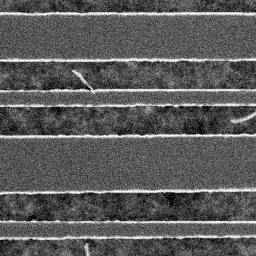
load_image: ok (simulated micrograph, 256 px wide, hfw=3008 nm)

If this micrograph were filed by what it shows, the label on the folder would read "lines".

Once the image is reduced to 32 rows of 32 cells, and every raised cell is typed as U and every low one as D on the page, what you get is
DDDDDDDDDDDDDDDDDDDDDDDDDDDDDDDD
DDDDDDDDDDDDDDDDDDDDDDDDDDDDDDDD
UUUUUUUUUUUUUUUUUUUUUUUUUUUUUUUU
UUUUUUUUUUUUUUUUUUUUUUUUUUUUUUUU
UUUUUUUUUUUUUUUUUUUUUUUUUUUUUUUU
UUUUUUUUUUUUUUUUUUUUUUUUUUUUUUUU
UUUUUUUUUUUUUUUUUUUUUUUUUUUUUUUU
UUUUUUUUUUUUUUUUDDUUUUUUUUDDUUDD
DDDDDDDDDDDDDDDDDDDDDDDDDDDDDDDD
DDDDDDDDDDDDDDDDDDDDDDDDDDDDDDDD
DDDDDDDDDDDDDDDDDDDDDDDDDDDDDDDD
UUUUUUUUUUUUUUUUUUUUUUUUUUUUUUUU
UUUUUUUUUUUUUUUUUUUUUUUUUUUUUUUU
DDDDDDDDDDDDDDDDDDDDDDDDDDDDDDDD
DDDDDDDDDDDDDDDDDDDDDDDDDDDDDDDD
DDDDDDDDDDDDDDDDDDDDDDDDDDDDDDDD
DDDDDDDDDDDDDDDDDDDDDDDDDDDDDDDD
UUUUUUUUUUUUUUUUUUUUUUUUUUUUUUUU
UUUUUUUUUUUUUUUUUUUUUUUUUUUUUUUU
UUUUUUUUUUUUUUUUUUUUUUUUUUUUUUUU
UUUUUUUUUUUUUUUUUUUUUUUUUUUUUUUU
UUUUUUUUUUUUUUUUUUUUUUUUUUUUUUUU
UUUUUUUUUUUUUUUUUUUUUUUUUUUUUUUU
UUUUUUUUUUUUUUUUUUUUUUUUUUUUUUUU
DDDDDDDDDDDDDDDDDDDDDDDDDDDDDDDD
DDDDDDDDDDDDDDDDDDDDDDDDDDDDDDDD
DDDDDDDDDDDDDDDDDDDDDDDDDDDDDDDD
DDDDDDDDDDDDDDDDDDDDDDDDDDDDDDDD
UUUUUUUUUUUUUUUUUUUUUUUUUUUUUUUU
UUUUUUUUUUUUUUUUUUUUUUUUUUUUUUUU
DDDDDDDDDDDDDDDDDDDDDDDDDDDDDDDD
DDDDDDDDDDDDDDDDDDDDDDDDDDDDDDDD